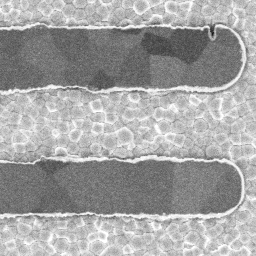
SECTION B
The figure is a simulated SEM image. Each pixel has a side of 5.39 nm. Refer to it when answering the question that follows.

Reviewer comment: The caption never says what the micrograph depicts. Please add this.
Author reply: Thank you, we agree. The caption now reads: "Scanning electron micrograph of one or a few lines or trenches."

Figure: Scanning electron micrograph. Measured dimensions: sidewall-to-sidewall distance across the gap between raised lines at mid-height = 380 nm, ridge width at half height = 315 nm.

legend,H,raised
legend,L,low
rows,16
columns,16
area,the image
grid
LLLLLLLLLLLLLLLL
LLLLLLLLLLLLLLLL
HHHHHHHHHHHHHHHL
HHHHHHHHHHHHHHHL
HHHHHHHHHHHHHHHL
HHHLLHHHHHHHHHLL
LLLLLLLLLLLLLLLL
LLLLLLLLLLLLLLLL
LLLLLLLLLLLLLLLL
LLLLLLLLLLLLLLLL
HHHHHHHHHHHHHHHL
HHHHHHHHHHHHHHHL
HHHHHHHHHHHHHHHL
LLLLLLHLHHHLHLLL
LLLLLLLLLLLLLLLL
LLLLLLLLLLLLLLLL